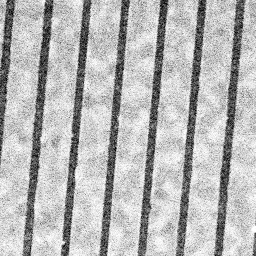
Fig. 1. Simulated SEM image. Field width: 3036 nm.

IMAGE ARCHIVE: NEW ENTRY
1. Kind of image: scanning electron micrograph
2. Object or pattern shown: parallel lines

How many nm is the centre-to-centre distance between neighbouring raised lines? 452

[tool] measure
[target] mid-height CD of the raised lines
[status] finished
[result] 0.347 micrometres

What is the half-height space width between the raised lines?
102 nm